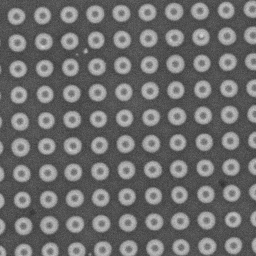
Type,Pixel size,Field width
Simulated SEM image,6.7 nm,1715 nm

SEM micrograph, an array of small figures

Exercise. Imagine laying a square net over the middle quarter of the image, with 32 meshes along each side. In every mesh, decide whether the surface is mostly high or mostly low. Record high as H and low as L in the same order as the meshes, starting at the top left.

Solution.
HHHHLLHHHHLLLHHHHLLHHHHLLLHHHHLL
HHHHLLHHHHLLLHHHHLLLHHHLLLHHHHLL
HHHLLLLHHLLLLLLLLLLLLLLLLLLLLLLL
LLLLLLLLLLLLLLLLLLLLLLLLLLLLLLLL
LLLLLLLLLLLLLLLLLLLLLLLLLLLHHLLL
LHHLLLLHHHLLLHHHLLLLHHHLLLHHHHLL
HHHHLLHHHHLLLHHHHLLHHHHHLLHHHHLL
HHHHLLHHHHHLLHHHHLLLHHHLLLHHHHLL
HHHHLLLHHHLLLHHHHLLLHHHLLLLHHLLL
LLLLLLLLLLLLLLLLLLLLLLLLLLLLLLLL
LLLLLLLLLLLLLLLLLLLLLLLLLLLLLLLL
LLLLLLLLLLLLLLLHLLLLLHLLLLLHHHLL
HHHHLLLHHHLLLHHHHLLLHHHHLLHHHHLL
HHHHLLLHHHHLLHHHHLLLHHHHLLHHHHLL
HHHHLLLHHHHLLHHHHLLLHHHLLLLHHHLL
LHHLLLLLHHLLLLHHLLLLLLLLLLLLLLLL
LLLLLLLLLLLLLLLLLLLLLLLLLLLLLLLL
LLLLLLLLLLLLLLLLLLLLLLLLLLLLLLLL
LHHLLLLLHHLLLLHHHLLLHHHLLLLHHHLL
HHHHLLLHHHHLLHHHHHLLHHHHLLLHHHLL
HHHHLLLHHHHLLHHHHHLLHHHHLLLHHHLL
HHHHLLLHHHHLLLHHHLLLHHHLLLLLHLLL
LHHLLLLLLLLLLLLLLLLLLLLLLLLLLLLL
LLLLLLLLLLLLLLLLLLLLLLLLLLLLLLLL
LLLLLLLLLLLLLLLHLLLLLHHLLLLHHHLL
LHHHLLLHHHHLLLHHHHLLHHHHLLLHHHHL
HHHHLLLHHHHLLLHHHHLLHHHHLLLHHHHL
HHHHLLLHHHHLLLHHHLLLHHHHLLLHHHLL
LHHHLLLLHHLLLLLHHLLLLLLLLLLLLLLL
LLLLLLLLLLLLLLLLLLLLLLLLLLLLLLLL
LLLLLLLLLLLLLLLLLLLLLLLLLLLLLLLL
LLLLLLLLHHLLLLHHHLLLLHHHLLLHHHLL